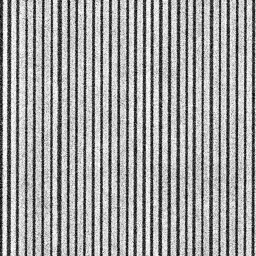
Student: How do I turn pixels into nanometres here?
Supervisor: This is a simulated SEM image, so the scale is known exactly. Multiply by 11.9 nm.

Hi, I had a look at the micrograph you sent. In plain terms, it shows parallel lines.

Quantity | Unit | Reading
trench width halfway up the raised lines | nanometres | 35.7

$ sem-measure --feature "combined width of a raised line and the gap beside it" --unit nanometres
100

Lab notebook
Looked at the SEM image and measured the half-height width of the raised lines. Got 58.1 nanometres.